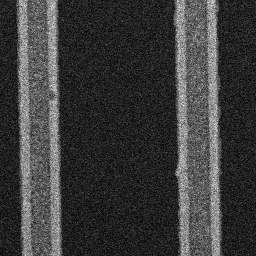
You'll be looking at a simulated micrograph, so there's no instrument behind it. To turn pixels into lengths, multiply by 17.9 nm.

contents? one or a few lines or trenches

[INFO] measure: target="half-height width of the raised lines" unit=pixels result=30.6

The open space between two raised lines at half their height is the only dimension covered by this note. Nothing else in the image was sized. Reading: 2280 nm